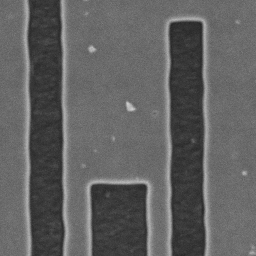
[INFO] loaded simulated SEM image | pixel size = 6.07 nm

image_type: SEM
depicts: groups of lines, slits or small figures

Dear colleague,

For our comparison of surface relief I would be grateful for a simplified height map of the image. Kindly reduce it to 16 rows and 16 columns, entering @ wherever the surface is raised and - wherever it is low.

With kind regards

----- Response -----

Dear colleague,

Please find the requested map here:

@@--@@@@@@@@@@@@
@@--@@@@@@@-@@@@
@@--@@@@@@@--@@@
@@--@@@@@@@--@@@
@@--@@@@@@@--@@@
@@--@@@@@@@--@@@
@@--@@@@@@@--@@@
@@--@@@@@@@--@@@
@@--@@@@@@@--@@@
@@--@@@@@@@--@@@
@@--@@@@@@@--@@@
@@--@@---@@--@@@
@@--@@---@@--@@@
@@--@@---@@--@@@
@@--@@---@@--@@@
@@--@@---@@--@@@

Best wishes